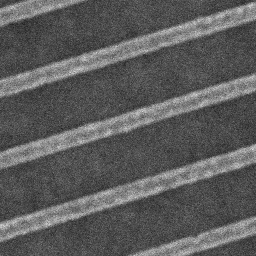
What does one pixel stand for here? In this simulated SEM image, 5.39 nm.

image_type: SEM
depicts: one or a few lines or trenches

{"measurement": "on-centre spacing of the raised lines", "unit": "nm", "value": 369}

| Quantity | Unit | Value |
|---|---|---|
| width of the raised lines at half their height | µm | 0.074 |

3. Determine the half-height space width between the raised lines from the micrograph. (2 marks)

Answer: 295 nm